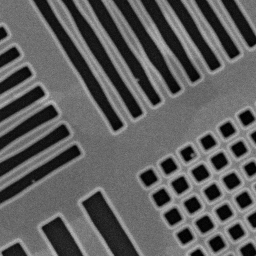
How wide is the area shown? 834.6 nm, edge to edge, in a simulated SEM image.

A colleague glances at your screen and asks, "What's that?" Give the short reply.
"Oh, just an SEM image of groups of lines, slits or small figures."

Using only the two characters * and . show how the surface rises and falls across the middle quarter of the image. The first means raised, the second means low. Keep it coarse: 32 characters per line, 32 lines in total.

**....***....***....**....***...
***....***....**....***....***..
****....**....***....***...***..
****....***....**....***....***.
*****....**....***....***....**.
*****.....**....**....***....***
******....***....**....***...***
******.....**....***....***.****
*******....***....***...********
********....***...***...********
********....***....***.*********
*********....***....************
**********...***....************
**********....***.**************
***********....*****************
.**********....*****************
.***********..******************
..******************************
.*******************************
********************************
*...**************************..
....*************************...
.....************************...
....**********************.***..
..**********************....**.*
************************.....***
********************...*....****
*******************....**..*****
*******************.....****..**
*******************....****....*
********************..*****....*
************************..*....*